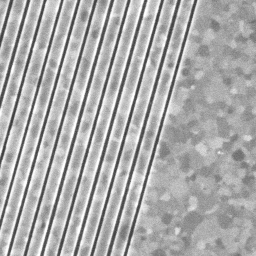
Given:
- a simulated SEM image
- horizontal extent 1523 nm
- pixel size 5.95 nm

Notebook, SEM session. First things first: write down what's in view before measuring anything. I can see parallel lines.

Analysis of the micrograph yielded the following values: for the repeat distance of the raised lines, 95.9 nanometres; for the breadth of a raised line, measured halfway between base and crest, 69.5 nm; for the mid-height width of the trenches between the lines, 23.6 nm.